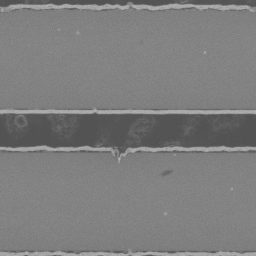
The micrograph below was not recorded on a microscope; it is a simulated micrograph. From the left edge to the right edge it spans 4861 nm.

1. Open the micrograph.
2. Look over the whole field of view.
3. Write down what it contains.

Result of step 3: one or a few lines or trenches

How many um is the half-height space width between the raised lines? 1.99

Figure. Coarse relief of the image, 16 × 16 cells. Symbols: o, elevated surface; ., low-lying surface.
o..............o
................
................
................
................
................
................
oooooooooooooooo
oooooooooooooooo
.......o........
................
................
................
................
................
................